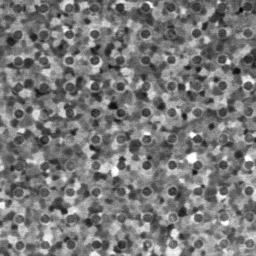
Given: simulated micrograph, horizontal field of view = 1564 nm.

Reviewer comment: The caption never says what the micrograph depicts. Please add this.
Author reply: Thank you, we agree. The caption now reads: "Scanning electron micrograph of a regular array of holes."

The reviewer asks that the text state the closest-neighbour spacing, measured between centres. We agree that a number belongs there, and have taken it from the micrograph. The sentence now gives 156 nm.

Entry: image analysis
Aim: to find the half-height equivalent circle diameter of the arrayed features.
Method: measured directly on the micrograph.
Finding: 63.2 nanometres